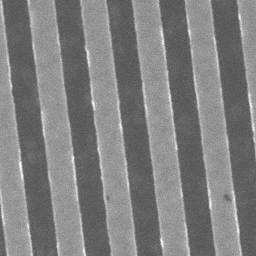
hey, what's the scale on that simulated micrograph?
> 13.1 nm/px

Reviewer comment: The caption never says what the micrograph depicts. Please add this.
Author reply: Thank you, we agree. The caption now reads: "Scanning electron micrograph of parallel lines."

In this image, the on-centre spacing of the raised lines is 682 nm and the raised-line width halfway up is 0.334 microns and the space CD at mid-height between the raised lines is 0.346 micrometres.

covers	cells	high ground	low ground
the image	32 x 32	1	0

00001110001110000111000111000011
00001110000110100111000111000011
00001110000111000111000111100011
10001110001111000111000011100011
10001110000111000111000011100011
10001110000111000111000011100011
10001111000111000111100011100011
10001110000111000111100011100001
10001111000111000011100011100001
10000111000111000011100011100001
10000111000111100011100011110001
10000111000111100011100001110001
11000111000011100011100001110001
11000111000011100011100001110001
11000111100011100011110001110001
11000111100011100011110001110000
11000111100011100001110001110000
11000011100011100001110001110000
11000011100011110001110001111000
11100011100011110001110001111000
11100011100001110001110000111000
11100011100001110001110000111000
11100011100001010001111000011000
11100011100001110001111000011000
11100011110000110001111000100000
11100001110001110000111000110000
11100001110001110000111000111100
11100001110001111000111000111100
11110001110001111000111000011100
01110001110000111000111000011100
01110001110000111000111100011100
01110001111000111000111100011100